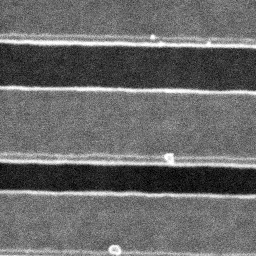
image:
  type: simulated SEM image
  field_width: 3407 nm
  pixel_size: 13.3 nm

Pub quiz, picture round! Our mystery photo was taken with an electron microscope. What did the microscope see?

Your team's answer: lines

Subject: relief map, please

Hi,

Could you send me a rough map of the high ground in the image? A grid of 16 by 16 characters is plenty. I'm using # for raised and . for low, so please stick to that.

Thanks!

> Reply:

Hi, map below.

################
################
################
................
................
................
################
################
################
################
................
................
################
################
################
################